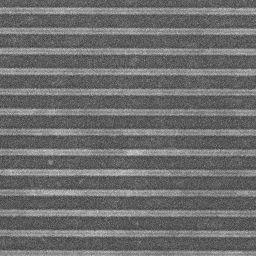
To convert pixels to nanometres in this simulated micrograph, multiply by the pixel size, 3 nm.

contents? parallel lines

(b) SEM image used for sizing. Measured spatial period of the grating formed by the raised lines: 0.0608 microns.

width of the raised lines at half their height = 4.5 pixels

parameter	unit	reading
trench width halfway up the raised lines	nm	47.7